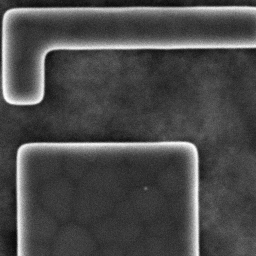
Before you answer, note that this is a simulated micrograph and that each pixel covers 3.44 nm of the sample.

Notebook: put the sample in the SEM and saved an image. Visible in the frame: wiring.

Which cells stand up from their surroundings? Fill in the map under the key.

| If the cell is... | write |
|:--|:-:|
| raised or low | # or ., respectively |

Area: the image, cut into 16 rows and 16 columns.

....############
################
################
###.............
###.............
###.............
.#..............
................
................
.###########....
.###########....
.###########....
.###########....
.###########....
.###########....
.###########....